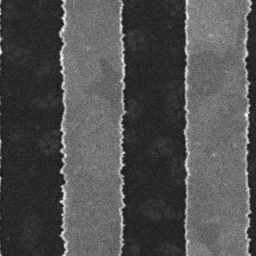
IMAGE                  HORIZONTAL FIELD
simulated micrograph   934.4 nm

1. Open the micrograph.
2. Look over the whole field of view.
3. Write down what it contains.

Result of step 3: one or a few lines or trenches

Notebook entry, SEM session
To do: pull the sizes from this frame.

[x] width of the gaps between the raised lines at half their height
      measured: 0.232 microns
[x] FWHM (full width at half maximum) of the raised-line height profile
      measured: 221 nanometres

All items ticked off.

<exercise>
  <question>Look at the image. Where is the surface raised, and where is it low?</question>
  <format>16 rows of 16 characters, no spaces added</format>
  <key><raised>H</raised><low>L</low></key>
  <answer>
LLLLHHHHLLLLHHHH
LLLLHHHHLLLLHHHL
LLLLHHHHLLLLHHHL
LLLLHHHHLLLLHHHL
LLLLHHHHLLLLHHHL
LLLLHHHHLLLLHHHL
LLLLHHHHLLLLHHHH
LLLLHHHHLLLLHHHH
LLLLHHHHLLLLHHHL
LLLLHHHHLLLLHHHL
LLLLHHHHLLLLHHHL
LLLLHHHHLLLLHHHL
LLLLHHHHLLLLHHHH
LLLLHHHHLLLLHHHH
LLLLHHHHLLLLHHHL
LLLLHHHHLLLLHHHH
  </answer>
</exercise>